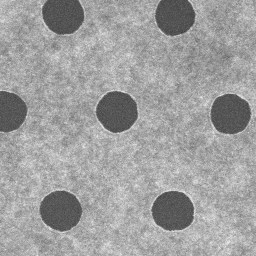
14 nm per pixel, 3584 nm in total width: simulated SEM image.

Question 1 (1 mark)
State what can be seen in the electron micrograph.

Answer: holes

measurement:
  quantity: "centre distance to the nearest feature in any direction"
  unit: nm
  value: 1570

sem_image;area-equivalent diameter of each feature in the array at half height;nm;592